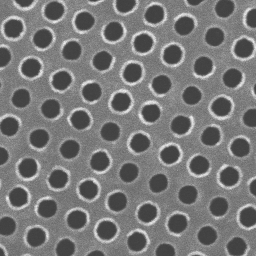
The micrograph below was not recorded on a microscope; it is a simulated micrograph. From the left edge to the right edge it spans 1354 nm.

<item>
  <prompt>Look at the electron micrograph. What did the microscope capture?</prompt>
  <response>a regular array of holes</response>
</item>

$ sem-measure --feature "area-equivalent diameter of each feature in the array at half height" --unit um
0.0981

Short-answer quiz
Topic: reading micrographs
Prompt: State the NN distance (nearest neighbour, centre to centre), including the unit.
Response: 163 nanometres